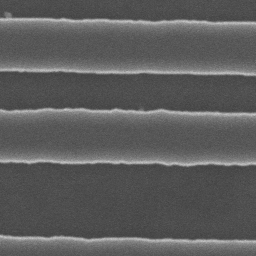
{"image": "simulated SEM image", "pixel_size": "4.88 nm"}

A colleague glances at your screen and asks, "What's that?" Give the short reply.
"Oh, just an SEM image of lines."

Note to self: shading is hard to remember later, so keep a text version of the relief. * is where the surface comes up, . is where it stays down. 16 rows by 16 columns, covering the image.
................
****************
****************
****************
....************
................
................
****************
****************
****************
................
................
................
................
................
****************